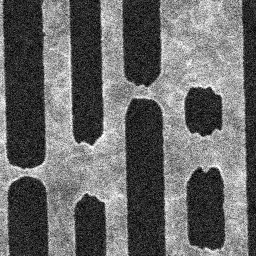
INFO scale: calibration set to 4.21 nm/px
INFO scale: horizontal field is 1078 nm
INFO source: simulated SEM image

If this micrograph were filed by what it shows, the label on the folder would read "parallel lines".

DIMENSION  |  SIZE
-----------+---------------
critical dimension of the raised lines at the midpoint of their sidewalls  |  91.5 nm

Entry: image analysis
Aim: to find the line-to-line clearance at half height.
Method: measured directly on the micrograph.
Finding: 38.6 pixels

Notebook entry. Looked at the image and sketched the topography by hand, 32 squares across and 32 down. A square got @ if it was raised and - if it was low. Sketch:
-----@@@@----@@-----@@@@@@@@@@--
-----@@@@----@@-----@@@@@@@@@@--
-----@@@@----@@-----@@@@@@@@@@--
-----@@@@----@@-----@@@@@@@@@@--
------@@@----@@-----@@@@@@@@@@--
------@@@----@@-----@@@@@@@@@@--
------@@@----@@-----@@@@@@@@@@--
------@@@----@@-----@@@@@@@@@@--
------@@@----@@-----@@@@@@@@@@--
------@@@----@@@----@@@@@@@@@@--
------@@@----@@@@--@@@@@@@@@@@--
@-----@@@----@@@@@@@@@@----@@@--
@-----@@@----@@@---@@@@-----@@--
@-----@@@----@@@----@@@-----@@--
@-----@@@----@@@----@@@-----@@--
@-----@@@----@@@----@@@-----@@@-
@-----@@@----@@@-----@@@---@@@@-
@-----@@@---@@@@-----@@@@@@@@@@-
@-----@@@@@@@@@@-----@@@@@@@@@@-
@-----@@@@@@@@@@-----@@@@@@@@@@-
@----@@@@@@@@@@@-----@@@@@@@@@@-
@@@@@@@@@@@@@@@@-----@@@----@@@-
@@---@@@@@@@@@@@-----@@-----@@@-
@-----@@@@@@@@@@-----@@-----@@@-
@-----@@@@--@@@@-----@@-----@@@-
@-----@@@----@@@-----@@-----@@@-
@-----@@@----@@@-----@@-----@@@-
@-----@@@----@@@-----@@-----@@@-
@-----@@@----@@@-----@@-----@@@-
@-----@@@----@@@-----@@-----@@@-
@-----@@@----@@@-----@@@----@@@-
@-----@@@----@@@-----@@@@@@@@@@-